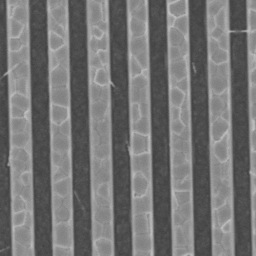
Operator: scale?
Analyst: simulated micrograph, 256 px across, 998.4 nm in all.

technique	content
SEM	parallel lines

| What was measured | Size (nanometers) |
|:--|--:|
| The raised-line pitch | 156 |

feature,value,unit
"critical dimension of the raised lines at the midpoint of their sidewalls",21.1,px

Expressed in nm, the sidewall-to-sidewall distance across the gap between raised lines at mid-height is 71.2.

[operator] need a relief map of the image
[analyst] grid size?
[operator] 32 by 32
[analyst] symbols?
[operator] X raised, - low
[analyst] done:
-XXX--XX---XXX--XX---XX---XX---X
-XXX--XX---XXX--XX---XX---XX---X
-XXX--XXX--XXX--XX---XX---XXX--X
-XXX--XXX--XXX--XX---XXX--XXX--X
-XXX--XXX--XXX--XXX--XXX--XXX--X
-XXX--XXX--XXX--XXX--XXX--XXX--X
-XXX--XXX--XXX--XXX--XXX--XXX--X
-XXX--XXX--XXX--XXX--XXX--XXX--X
-XXX--XXX--XXX--XXX--XXX--XXX--X
-XXX--XXX--XXX--XXX--XXX--XXX--X
-XXX--XXX--XXX--XXX--XXX--XXX--X
-XXX--XXX--XXX--XXX--XXX--XXX--X
-XXX--XXX--XXX--XXX--XXX--XXX--X
-XXX--XXX--XXX--XXX--XXX--XXX--X
-XXX--XXX--XXX--XXX--XXX--XXX--X
-XXX--XXX--XXX--XXX--XXX--XXX--X
-XXX--XXX--XXX--XXX--XXX--XXX--X
-XXX--XXX--XXX--XXX--XXX--XXX--X
-XXX--XXX--XXX--XXX--XXX--XXX--X
-XXX--XXX--XXX--XXX--XXX--XXX--X
-XXX--XXX--XXX--XXX--XXX--XXX--X
-XXX--XXX--XXX--XXX--XXX--XXX--X
-XXX--XXX--XXX--XXX--XXX--XXX--X
-XXX--XXX--XXX--XXX--XXX--XXX--X
-XXX--XXX--XXX--XXX--XXX--XXX--X
-XXX---XX--XXX--XXX--XXX--XXX--X
--XX---XX--XXX--XXX---XX--XXX--X
--XX---XX--XXX---XX---XX--XXX--X
--XX---XX--XXX---XX---XX--XXX---
--XX---XX---XX---XX---XX--XXX---
--XX---XX---XX---XX---XX---XX---
--XX---XX---XX---XX---XX---XX---